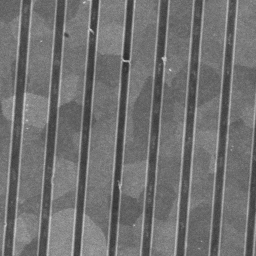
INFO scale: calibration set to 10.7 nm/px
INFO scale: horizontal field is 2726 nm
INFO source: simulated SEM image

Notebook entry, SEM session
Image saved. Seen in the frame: parallel lines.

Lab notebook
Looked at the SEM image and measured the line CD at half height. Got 25.9 px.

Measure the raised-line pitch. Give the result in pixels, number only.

34.3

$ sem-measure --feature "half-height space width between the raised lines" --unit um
0.0889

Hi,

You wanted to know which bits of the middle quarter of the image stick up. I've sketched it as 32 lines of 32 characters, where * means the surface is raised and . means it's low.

******..******...******..******.
******..******..*******..******.
******..******..*******..******.
*****..*******..*******..******.
*****..*******..*******..******.
*****..*******..******...******.
*****..*******..******...******.
*****..*******..******...******.
*****..*******..******...******.
*****..*******..******..*******.
*****..*******..******..*******.
*****..*******..******..*******.
*****..*******..******..******..
*****..*******..******..******..
*****..******..*******..******..
*****..******..*******..******..
****...******..*******..******..
****..*******..*******..******..
****..*******..******...******..
****..*******..******...******..
****..*******..******...******..
****..*******..******...******..
****..*******..******..*******..
****..*******..******..*******..
****..*******..******..*******..
****..*******..******..*******..
****..*******..******..******...
****..******..*******..******...
****..******..*******..******...
****..******..*******..******...
***...******..*******..******..*
***..*******..*******..******..*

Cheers